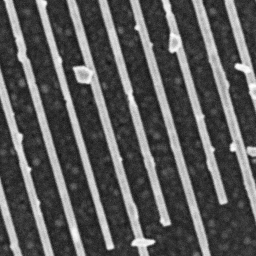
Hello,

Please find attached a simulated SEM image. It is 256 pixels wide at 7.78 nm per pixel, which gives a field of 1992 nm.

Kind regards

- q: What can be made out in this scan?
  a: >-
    parallel lines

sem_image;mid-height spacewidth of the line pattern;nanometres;174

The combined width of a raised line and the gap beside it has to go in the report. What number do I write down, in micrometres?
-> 0.236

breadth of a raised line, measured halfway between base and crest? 59.8 nm